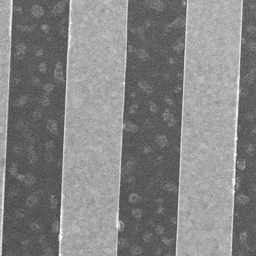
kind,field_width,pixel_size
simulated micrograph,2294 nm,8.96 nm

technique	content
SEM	one or a few lines or trenches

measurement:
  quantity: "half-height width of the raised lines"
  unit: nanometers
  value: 503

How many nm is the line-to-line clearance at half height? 522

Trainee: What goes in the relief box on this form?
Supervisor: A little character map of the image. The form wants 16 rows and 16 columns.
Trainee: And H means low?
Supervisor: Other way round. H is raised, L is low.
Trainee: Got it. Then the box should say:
HLLLHHHHLLLLHHHL
HLLLHHHHLLLLHHHL
HLLLHHHHLLLLHHHL
HLLLHHHHLLLLHHHL
HLLLHHHHLLLLHHHL
HLLLHHHHLLLHHHHL
LLLLHHHHLLLHHHHL
LLLLHHHHLLLHHHHL
LLLLHHHHLLLHHHHL
LLLLHHHHLLLHHHHL
LLLLHHHHLLLHHHHL
LLLLHHHLLLLHHHHL
LLLLHHHLLLLHHHHL
LLLLHHHLLLLHHHHL
LLLLHHHLLLLHHHHL
LLLLHHHLLLLHHHLL